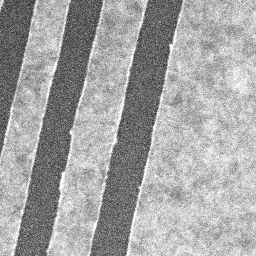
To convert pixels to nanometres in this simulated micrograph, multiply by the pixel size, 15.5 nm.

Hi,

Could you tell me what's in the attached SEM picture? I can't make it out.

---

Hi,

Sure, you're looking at one or a few lines or trenches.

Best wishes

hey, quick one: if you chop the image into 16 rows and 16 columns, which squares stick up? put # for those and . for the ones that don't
..##..###..#####
..##..###..#####
..##..###..#####
..##..##...#####
.##..###..######
.##..###..######
.##..###..######
.##..##...######
##..###...######
##..###..#######
##..###..#######
##..###..#######
##..##...#######
#...##..########
#..###..########
#..###..########